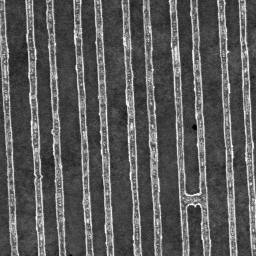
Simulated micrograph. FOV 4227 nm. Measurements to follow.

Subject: parallel lines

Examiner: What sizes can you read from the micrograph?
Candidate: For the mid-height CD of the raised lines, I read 96.8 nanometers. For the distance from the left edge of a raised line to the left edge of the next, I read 0.396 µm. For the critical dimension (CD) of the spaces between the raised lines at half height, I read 0.324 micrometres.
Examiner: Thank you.